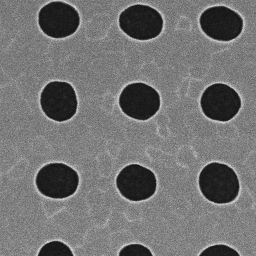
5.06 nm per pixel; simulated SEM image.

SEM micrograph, a regular array of holes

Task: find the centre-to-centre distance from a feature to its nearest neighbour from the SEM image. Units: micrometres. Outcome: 0.4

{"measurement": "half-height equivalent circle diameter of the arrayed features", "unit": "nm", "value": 196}